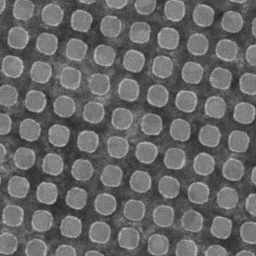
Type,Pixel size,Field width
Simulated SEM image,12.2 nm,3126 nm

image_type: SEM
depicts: a regular array of raised bodies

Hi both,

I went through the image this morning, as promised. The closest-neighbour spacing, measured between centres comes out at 354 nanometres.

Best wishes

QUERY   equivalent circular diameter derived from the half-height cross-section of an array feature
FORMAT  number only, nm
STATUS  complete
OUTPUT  257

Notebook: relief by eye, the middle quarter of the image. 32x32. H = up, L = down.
LLLLLLLLLLLLLLLHHHHHLLHHHHHLLLHH
HHHLLLLLLLLLLLLLHHHLLLHHHHHLLLHH
HHHHLLLLHLLLLLLLLLLLLLLHHHHLLLHH
HHHHLLLHHHHLLLLLLLLLLLLLLLLLLLHH
HHHHLLHHHHHLLLHHHHLLLLLLLLLLLLLH
HHHHLLHHHHHLLLHHHHLLLLHHLLLLLLLL
LLLLLLLHHHHLLLHHHHHLLHHHHHLLLLLL
LLLLLLLLLHLLLLHHHHLLLHHHHHLLLHHH
HLLLLLLLLLLLLLHHHHLLLHHHHHLLHHHH
HHLLLLLLLLLLLLLLLLLLLLHHHHLLHHHH
HHHLLHHHHLLLLLLLLLLLLLLHLLLLHHHH
HHLLLHHHHHLLLHHHLLLLLLLLLLLLLHHH
HHLLLHHHHHLLHHHHHLLLLLLLLLLLLLLL
LLLLLHHHHHLLHHHHHLLLHHHHLLLLLLLL
LLLLLLLHHLLLHHHHHLLLHHHHLLLHHHLL
LLLLLLLLLLLLLHHHLLLHHHHHLLLHHHHL
HLLLLLLLLLLLLLLLLLLLHHHHLLLHHHHL
HLLLHHHHLLLLLLLLLLLLLHHLLLLHHHHL
HLLLHHHHLLLLHHLLLLLLLLLLLLLHHHHL
HLLHHHHHLLLHHHHHLLLLLLLLLLLLLLLL
LLLLHHHHLLLHHHHHLLHHHHHLLLLLLLLL
LLLLLHHHLLLHHHHHLLHHHHHLLLHHHLLL
LLLLLLLLLLLLHHHHLLHHHHHLLHHHHHLL
LLLLLLLLLLLLLLLLLLHHHHHLLHHHHHLL
LLLHHHLLLLLLLLLLLLLLHHLLLHHHHHLL
LLHHHHHLLLLHLLLLLLLLLLLLLLHHHLLL
LLHHHHHLLLHHHHLLLLLLLLLLLLLLLLLL
LLHHHHHLLLHHHHLLLHHHHLLLLLLLLLLL
LLLHHHLLLHHHHHLLLHHHHLLLLHHLLLLL
LLLLLLLLLLHHHHLLLHHHHHLLHHHHLLLL
LLLLLLLLLLLHHLLLLHHHHLLLHHHHHLLL
LLHHHLLLLLLLLLLLLLHHHLLLHHHHHLLH